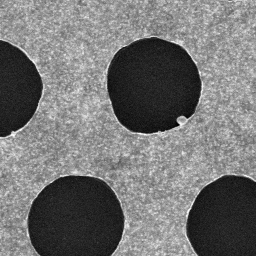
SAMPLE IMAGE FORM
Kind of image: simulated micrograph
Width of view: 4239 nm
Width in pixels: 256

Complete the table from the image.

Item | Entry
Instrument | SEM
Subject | holes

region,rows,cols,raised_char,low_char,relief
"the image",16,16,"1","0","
1111111111111111
1111111111111111
1111111110111111
0011111000001111
0011111000001111
0001111000000111
0011111000001111
0011111000011111
1111111111111111
1111111111111111
1111111111111111
1110000111111000
1100000111110000
1100000011110000
1100000011110000
1100000111110000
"